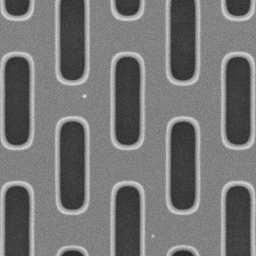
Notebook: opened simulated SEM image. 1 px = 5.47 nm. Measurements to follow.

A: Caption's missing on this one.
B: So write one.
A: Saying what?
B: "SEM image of groups of lines, slits or small figures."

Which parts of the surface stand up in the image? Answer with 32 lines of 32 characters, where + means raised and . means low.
....+++....+++....+++....+++....
+...+++....+++....+++....+++...+
+++++++....++++++++++....+++++++
+++++++....++++++++++....+++++++
+++++++....++++++++++....+++++++
+++++++....++++++++++....+++++++
+++++++....++++++++++....+++++++
+...+++....++++..++++....+++...+
....+++....+++....+++....+++...+
....+++....+++....+++...++++....
....++++++++++....++++++++++....
....++++++++++....++++++++++....
....++++++++++....++++++++++....
....++++++++++....++++++++++....
....++++++++++....++++++++++....
....++++..++++....+++...++++....
....+++....+++....+++....+++....
+...+++....+++....+++....+++...+
+++++++....++++++++++....+++++++
+++++++....++++++++++....+++++++
+++++++....++++++++++....+++++++
+++++++....++++++++++....+++++++
+++++++....++++++++++....+++++++
+...+++....++++..++++....+++...+
....+++....+++....+++....+++...+
....+++....+++....+++...++++....
....++++++++++....++++++++++....
....++++++++++....++++++++++....
....++++++++++....++++++++++....
....++++++++++....++++++++++....
....++++++++++....++++++++++....
....++++..++++....++++..++++....